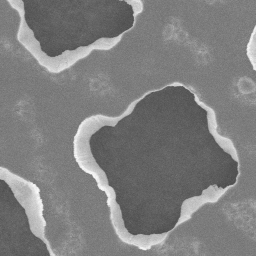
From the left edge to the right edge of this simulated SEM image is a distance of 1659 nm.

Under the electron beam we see holes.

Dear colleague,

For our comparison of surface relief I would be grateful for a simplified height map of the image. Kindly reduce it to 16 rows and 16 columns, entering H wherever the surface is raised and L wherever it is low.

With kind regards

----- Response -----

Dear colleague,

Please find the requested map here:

HLLLLLLLHHHHHHHH
HLLLLLLLHHHHHHHH
HHLLLLLHHHHHHHHH
HHHLHHHHHHHHHHHH
HHHHHHHHHHHHHHHH
HHHHHHHHHHLLHHHH
HHHHHHHHLLLLHHHH
HHHHHHHLLLLLLHHH
HHHHHLLLLLLLLHHH
HHHHHLLLLLLLLLHH
HHHHHHLLLLLLLLLH
LHHHHHHLLLLLLLHH
LLHHHHHLLLLLHHHH
LLHHHHHLLLLHHHHH
LLLHHHHHLLHHHHHH
LLLHHHHHHHHHHHHH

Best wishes